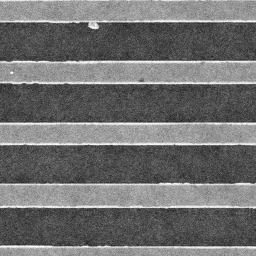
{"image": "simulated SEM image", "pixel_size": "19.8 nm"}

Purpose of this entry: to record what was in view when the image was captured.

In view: lines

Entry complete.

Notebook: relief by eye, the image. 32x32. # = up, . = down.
################################
################################
################################
................................
................................
................................
................................
................................
################################
################################
................................
................................
................................
................................
................................
################################
################################
################################
................................
................................
................................
................................
................................
################################
################################
################################
................................
................................
................................
................................
................................
################################